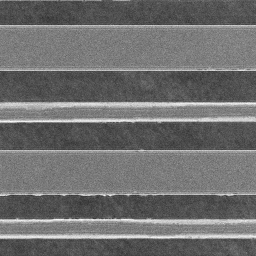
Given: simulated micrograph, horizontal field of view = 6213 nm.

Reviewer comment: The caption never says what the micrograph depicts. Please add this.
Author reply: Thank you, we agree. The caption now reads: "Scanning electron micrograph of lines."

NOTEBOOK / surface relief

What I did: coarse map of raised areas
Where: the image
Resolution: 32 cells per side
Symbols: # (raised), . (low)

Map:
................................
................................
................................
################################
################################
################################
################################
################################
################################
................................
................................
................................
................................
################################
################################
................................
................................
................................
................................
################################
################################
################################
################################
################################
................................
................................
................................
................................
################################
################################
................................
................................